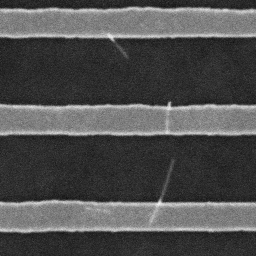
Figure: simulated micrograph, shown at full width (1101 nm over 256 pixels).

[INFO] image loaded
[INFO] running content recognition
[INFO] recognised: lines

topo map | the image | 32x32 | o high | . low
................................
oooooooooooooooooooooooooooooooo
oooooooooooooooooooooooooooooooo
oooooooooooooooooooooooooooooooo
oooooooooooooooooooooooooooooooo
................................
................................
................................
................................
................................
................................
................................
................................
oooooooooooooooooooooooooooooooo
oooooooooooooooooooooooooooooooo
oooooooooooooooooooooooooooooooo
oooooooooooooooooooooooooooooooo
................................
................................
................................
................................
................................
................................
................................
................................
oooooooooooooooooooooooooooooooo
oooooooooooooooooooooooooooooooo
oooooooooooooooooooooooooooooooo
oooooooooooooooooooooooooooooooo
................................
................................
................................